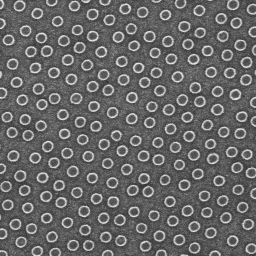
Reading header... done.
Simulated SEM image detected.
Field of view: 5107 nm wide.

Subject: a regular array of raised bodies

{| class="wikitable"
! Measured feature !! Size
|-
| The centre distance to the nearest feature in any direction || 341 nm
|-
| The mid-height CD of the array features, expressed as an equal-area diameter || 201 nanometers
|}